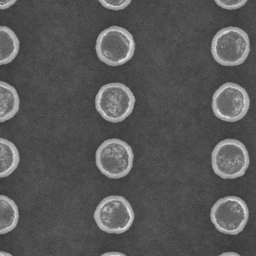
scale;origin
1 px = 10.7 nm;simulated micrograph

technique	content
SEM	a regular array of raised bodies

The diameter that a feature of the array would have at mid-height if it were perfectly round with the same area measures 375 nm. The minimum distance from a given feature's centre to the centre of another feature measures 597 nm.